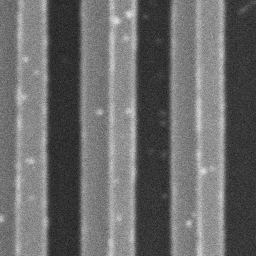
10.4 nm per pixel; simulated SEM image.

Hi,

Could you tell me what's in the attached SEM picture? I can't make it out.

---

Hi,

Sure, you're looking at lines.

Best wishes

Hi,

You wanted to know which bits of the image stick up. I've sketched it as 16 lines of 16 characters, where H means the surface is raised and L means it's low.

HHHLLHHHLLLHHHLL
HHHLLHHHLLLHHHLL
HHHLLHHHLLLHHHLL
HHHLLHHHLLLHHHLL
HHHLLHHHLLLHHHLL
HHHLLHHHLLLHHHLL
HHHLLHHHLLLHHHLL
HHHLLHHHLLLHHHLL
HHHLLHHHLLLHHHLL
HHHLLHHHLLLHHHLL
HHHLLHHHLLLHHHLL
HHHLLHHHLLLHHHLL
HHHLLHHHLLLHHHLL
HHHLLHHHLLLHHHLL
HHHLLHHHLLLHHHLL
HHHLLHHHLLLHHHLL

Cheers